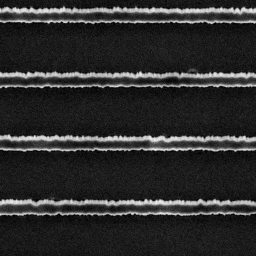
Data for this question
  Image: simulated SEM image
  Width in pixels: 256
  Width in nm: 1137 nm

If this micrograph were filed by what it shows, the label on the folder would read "lines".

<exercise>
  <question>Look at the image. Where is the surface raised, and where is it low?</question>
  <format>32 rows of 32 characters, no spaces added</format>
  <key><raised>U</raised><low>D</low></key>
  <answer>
DDDDDDDDDDDDDDDDDDDDDDDDDDDDDDDD
UUUUUUUUUUUUUUUUUUUUUUUUUUUUUUUU
UUUUUUUUUUUUUUUUUUUUUUUUUUUUUUUU
DDDDDDDDDDDDDDDDDDDDDDDDDDDDDDDD
DDDDDDDDDDDDDDDDDDDDDDDDDDDDDDDD
DDDDDDDDDDDDDDDDDDDDDDDDDDDDDDDD
DDDDDDDDDDDDDDDDDDDDDDDDDDDDDDDD
DDDDDDDDDDDDDDDDDDDDDDDDDDDDDDDD
DDDDDDDDDDDDDDDDDDDDDDDDDDDDDDDD
UUUUUUUUUUUUUUUUUUUUUUUUUUUUUUUU
UUUUUUUUUUUUUUUUUUUUUUUUUUUUUUUU
DDDDDDDDDDDDDDDDDDDDDDDDDDDDDDDD
DDDDDDDDDDDDDDDDDDDDDDDDDDDDDDDD
DDDDDDDDDDDDDDDDDDDDDDDDDDDDDDDD
DDDDDDDDDDDDDDDDDDDDDDDDDDDDDDDD
DDDDDDDDDDDDDDDDDDDDDDDDDDDDDDDD
DDDDDDDDDDDDDDDDDDDDDDDDDDDDDDDD
UUUUUUUUUUUUUUUUUUUUUUUUUUUUUUUU
UUUUUUUUUUUUUUUUUUUUUUUUUUUUUUUU
DDDDDDDDDDDDDDDDDDDDDDDDDDDDDDDD
DDDDDDDDDDDDDDDDDDDDDDDDDDDDDDDD
DDDDDDDDDDDDDDDDDDDDDDDDDDDDDDDD
DDDDDDDDDDDDDDDDDDDDDDDDDDDDDDDD
DDDDDDDDDDDDDDDDDDDDDDDDDDDDDDDD
DDDDDDDDDDDDDDDDDDDDDDDDDDDDDDDD
UUUUUUUUUUUUUUUUUUUUUUUUUUUUUUUU
UUUUUUUUUUUUUUUUUUUUUUUUUUUUUUUU
DDDDDDDDDDDDDDDDDDDDDDDDDDDDDDDD
DDDDDDDDDDDDDDDDDDDDDDDDDDDDDDDD
DDDDDDDDDDDDDDDDDDDDDDDDDDDDDDDD
DDDDDDDDDDDDDDDDDDDDDDDDDDDDDDDD
DDDDDDDDDDDDDDDDDDDDDDDDDDDDDDDD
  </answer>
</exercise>